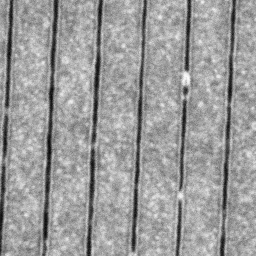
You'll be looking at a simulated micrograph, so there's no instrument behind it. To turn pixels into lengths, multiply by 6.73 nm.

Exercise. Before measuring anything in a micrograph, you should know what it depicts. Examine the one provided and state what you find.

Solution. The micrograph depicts parallel lines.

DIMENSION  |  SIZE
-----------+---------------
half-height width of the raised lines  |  47.9 nanometres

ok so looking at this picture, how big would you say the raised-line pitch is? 299 nm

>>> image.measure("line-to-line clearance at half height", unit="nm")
245